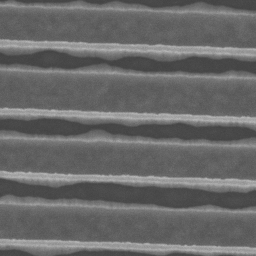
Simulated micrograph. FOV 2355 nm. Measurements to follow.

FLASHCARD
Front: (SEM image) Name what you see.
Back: lines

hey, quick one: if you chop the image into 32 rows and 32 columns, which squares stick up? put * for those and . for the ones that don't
**..............................
*****************************...
********************************
********************************
********************************
********************************
............********************
................................
***.............................
***************************.***.
********************************
********************************
********************************
********************************
*.******************************
...............................*
................................
******************..............
********************************
********************************
********************************
********************************
...*****************************
.............................**.
................................
***********.*...................
********************************
********************************
********************************
********************************
********************************
....................*...********